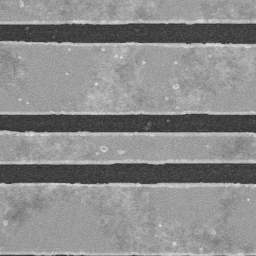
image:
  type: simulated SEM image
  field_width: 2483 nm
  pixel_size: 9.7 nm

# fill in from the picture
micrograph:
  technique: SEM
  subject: lines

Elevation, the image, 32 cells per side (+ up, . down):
++++++++++++++++++++++++++++++++
++++++++++++++++++++++++++++++++
++++++++++++++++++++++++++++++++
................................
................................
++++++++++..++++++++............
++++++++++++++++++++++++++++++++
++++++++++++++++++++++++++++++++
++++++++++++++++++++++++++++++++
++++++++++++++++++++++++++++++++
++++++++++++++++++++++++++++++++
++++++++++++++++++++++++++++++++
++++++++++++++++++++++++++++++++
++++++++++++++++++++++++++++++++
................................
................................
++........+.....................
++++++++++++++++++++++++++++++++
++++++++++++++++++++++++++++++++
++++++++++++++++++++++++++++++++
................................
................................
................................
++++++++++++++++++++++++++++++++
++++++++++++++++++++++++++++++++
++++++++++++++++++++++++++++++++
++++++++++++++++++++++++++++++++
++++++++++++++++++++++++++++++++
++++++++++++++++++++++++++++++++
++++++++++++++++++++++++++++++++
++++++++++++++++++++++++++++++++
++++++++++++++++++++++++++++++++